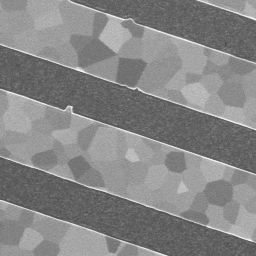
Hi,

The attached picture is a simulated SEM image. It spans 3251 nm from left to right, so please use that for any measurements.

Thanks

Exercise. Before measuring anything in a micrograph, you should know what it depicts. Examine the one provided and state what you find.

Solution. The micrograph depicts one or a few lines or trenches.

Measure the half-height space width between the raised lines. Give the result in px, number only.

41.4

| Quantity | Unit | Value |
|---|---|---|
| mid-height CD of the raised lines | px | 64.2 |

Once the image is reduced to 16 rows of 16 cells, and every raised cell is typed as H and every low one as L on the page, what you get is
HHHHHHLLLLLLLLHH
HHHHHHHHHLLLLLLL
HHHHHHHHHHHHLLLL
LLHHHHHHHHHHHHHL
LLLLLHHHHHHHHHHH
LLLLLLLLHHHHHHHH
HHHLLLLLLLLHHHHH
HHHHHHLLLLLLLLHH
HHHHHHHHHLLLLLLL
HHHHHHHHHHHHLLLL
LLHHHHHHHHHHHHHL
LLLLLHHHHHHHHHHH
LLLLLLLLHHHHHHHH
HHHLLLLLLLLHHHHH
HHHHHHLLLLLLLLHH
HHHHHHHHHLLLLLLL